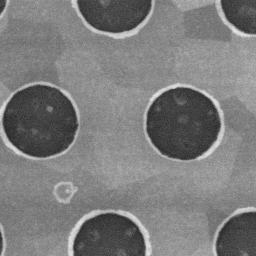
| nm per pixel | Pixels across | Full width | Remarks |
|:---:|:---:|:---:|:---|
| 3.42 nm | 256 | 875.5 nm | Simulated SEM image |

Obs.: holes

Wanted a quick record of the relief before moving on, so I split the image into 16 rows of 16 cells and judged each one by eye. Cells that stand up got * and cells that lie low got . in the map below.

*****....*****..
*****....*****..
****************
****************
****************
*...*******.****
.....****....***
.....****.....**
.....****.....**
*...******...***
****************
****************
****************
******..*******.
*****....*****..
*****....****...